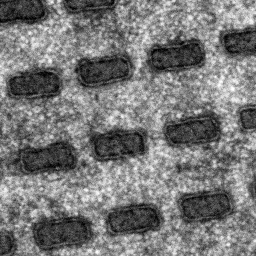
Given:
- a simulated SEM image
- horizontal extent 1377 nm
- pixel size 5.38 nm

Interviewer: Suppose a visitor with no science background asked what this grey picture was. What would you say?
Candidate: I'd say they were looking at a regular array of raised bodies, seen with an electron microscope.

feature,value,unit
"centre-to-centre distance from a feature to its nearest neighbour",0.39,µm